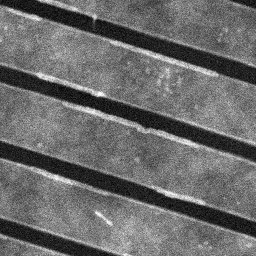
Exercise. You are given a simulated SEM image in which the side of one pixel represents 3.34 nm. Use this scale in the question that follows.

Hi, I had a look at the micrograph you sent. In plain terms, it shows one or a few lines or trenches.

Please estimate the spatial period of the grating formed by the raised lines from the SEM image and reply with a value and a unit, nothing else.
244 nanometres